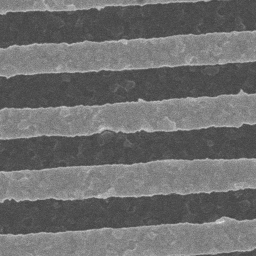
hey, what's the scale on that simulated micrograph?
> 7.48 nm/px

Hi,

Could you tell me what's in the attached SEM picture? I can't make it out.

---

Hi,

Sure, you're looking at one or a few lines or trenches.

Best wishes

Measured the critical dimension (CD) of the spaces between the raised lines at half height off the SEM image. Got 233 nm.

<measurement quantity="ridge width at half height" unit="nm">230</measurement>